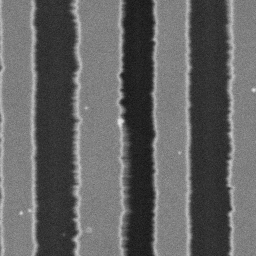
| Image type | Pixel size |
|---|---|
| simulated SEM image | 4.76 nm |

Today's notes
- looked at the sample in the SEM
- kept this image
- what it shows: lines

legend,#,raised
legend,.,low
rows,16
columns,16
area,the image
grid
##...###..##..##
##...###..##..##
##...###..##..##
##...###..##..##
##...###..##..##
##...###..##..##
##...###..##..##
##...###..##..##
##...###..##..##
##...###..##...#
##...###..##..##
##...###..##..##
##...###..##..##
##...###..##..##
##...###..##..##
##...###..##..##